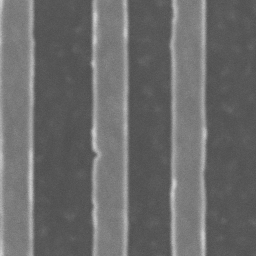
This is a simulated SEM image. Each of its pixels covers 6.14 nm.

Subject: one or a few lines or trenches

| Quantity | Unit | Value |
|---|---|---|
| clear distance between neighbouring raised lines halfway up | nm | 326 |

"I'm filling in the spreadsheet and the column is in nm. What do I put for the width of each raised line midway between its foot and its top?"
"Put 205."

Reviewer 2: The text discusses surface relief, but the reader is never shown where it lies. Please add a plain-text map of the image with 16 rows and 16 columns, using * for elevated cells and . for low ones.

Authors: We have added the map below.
**....**...**...
**....**...**...
**....**...**...
**....**...**...
**....**...**...
**....**...**...
**....**...**...
**....**...**...
**....**...**...
**....**...**...
**....**...**...
**....**...**...
**....**...**...
**....**...**...
**....**...**...
**....**...**...